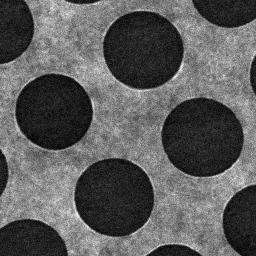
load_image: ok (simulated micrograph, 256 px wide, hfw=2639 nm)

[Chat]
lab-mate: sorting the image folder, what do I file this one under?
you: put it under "holes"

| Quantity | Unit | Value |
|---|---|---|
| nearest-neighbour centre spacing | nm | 1080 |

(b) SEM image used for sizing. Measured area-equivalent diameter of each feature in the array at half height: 822 nanometers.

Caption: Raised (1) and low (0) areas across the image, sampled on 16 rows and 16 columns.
0011111111110000
0011111000011001
0011111000011111
0111111000011111
1111111000011111
1100011100111111
1000001111100011
1000001111000001
1100011111000001
1111111111000001
0111100001100011
1111100001111111
1111100000111100
1111100001111100
0000110011111100
0000111111001110